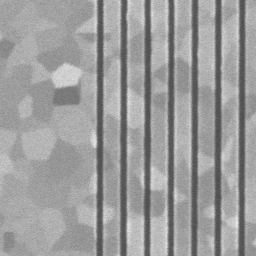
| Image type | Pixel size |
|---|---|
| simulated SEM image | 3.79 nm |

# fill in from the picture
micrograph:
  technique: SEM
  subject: parallel lines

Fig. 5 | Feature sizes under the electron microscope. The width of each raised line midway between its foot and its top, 60.7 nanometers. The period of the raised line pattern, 89.6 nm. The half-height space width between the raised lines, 26.6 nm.